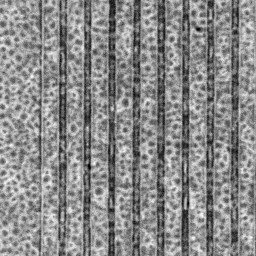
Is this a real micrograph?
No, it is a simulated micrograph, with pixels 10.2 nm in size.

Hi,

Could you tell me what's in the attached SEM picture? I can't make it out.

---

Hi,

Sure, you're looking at parallel lines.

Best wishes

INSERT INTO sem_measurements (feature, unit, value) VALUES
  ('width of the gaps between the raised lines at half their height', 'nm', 82.7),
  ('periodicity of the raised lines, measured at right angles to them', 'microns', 0.251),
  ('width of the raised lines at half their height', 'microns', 0.174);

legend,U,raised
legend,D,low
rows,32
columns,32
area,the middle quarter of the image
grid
DUUUUDDUUUUDDUUUUDDUUUUDDUUUUDDD
DUUUUDDUUUUDDUUUUDDUUUUDDUUUUDDD
DUUUUDDUUUUDDUUUUDDUUUUDDUUUUDDD
DUUUUDDUUUUDDUUUUDDUUUUDDUUUUDDD
DUUUUDDUUUUDDUUUUDDUUUUDDUUUUDDD
DUUUUDDUUUUDDUUUUDDUUUUDDUUUUDDD
DUUUUDDUUUUDDUUUUDDUUUUDDUUUUDDU
DUUUUDDUUUUDDUUUUDDUUUUDDUUUUDDU
DUUUUDDUUUUDDUUUUDDUUUUDDUUUUDDU
DUUUUDDUUUUDDUUUUDDUUUUDDUUUUDDU
DUUUUDDUUUUDDUUUUDDUUUUDDUUUUDDU
DUUUUDDUUUUDDUUUUDDUUUUDDUUUUDDU
DUUUUDDUUUUDDUUUUDDUUUUDDUUUUDDU
DUUUUDDUUUUDDUUUUDDUUUUDDUUUUDDU
DUUUUDDUUUUDDUUUUDDUUUUDDUUUUDDU
DUUUUDDUUUUDDUUUUDDUUUUDDUUUUDDU
DUUUUDDUUUUDDUUUUDDUUUUDDUUUUDDU
DUUUUDDUUUUDDUUUUDDUUUUDDUUUUDDU
DUUUUDDUUUUDDUUUUDDUUUUDDUUUUDDU
DUUUUDDUUUUDDUUUUDDUUUUDDUUUUDDU
DUUUUDDUUUUDDUUUUDDUUUUDDUUUUDDU
DUUUUDDUUUUDDUUUUDDUUUUDDUUUUDDU
DUUUUDDUUUUDDUUUUDDUUUUDDUUUUDDU
DUUUUDDUUUUDDUUUUDDUUUUDDUUUUDDU
DUUUUDDUUUUDDUUUUDDUUUUDDUUUUDDU
DUUUUDDUUUUDDUUUUDDUUUUDDUUUUDDU
DUUUUDDUUUUDDUUUUDDUUUUDDUUUUDDU
DUUUUDDUUUUDDUUUUDDUUUUDDUUUUDDU
DUUUUDDUUUUDDUUUUDDUUUUDDUUUUDDU
DUUUUDDUUUUDDUUUUDDUUUUDDUUUUDDU
DUUUUDDUUUUDDUUUUDDUUUUDDUUUUDDU
DUUUUDDUUUUDDUUUUDDUUUUDDUUUUDDU